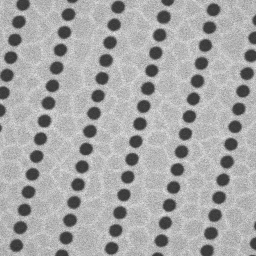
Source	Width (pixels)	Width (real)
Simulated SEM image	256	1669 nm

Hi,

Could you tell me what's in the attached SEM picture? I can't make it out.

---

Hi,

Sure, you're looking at a regular array of holes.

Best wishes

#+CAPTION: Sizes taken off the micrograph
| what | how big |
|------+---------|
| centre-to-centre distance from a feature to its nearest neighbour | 118 nm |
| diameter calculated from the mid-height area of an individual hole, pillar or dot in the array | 0.0809 um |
